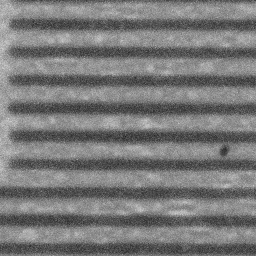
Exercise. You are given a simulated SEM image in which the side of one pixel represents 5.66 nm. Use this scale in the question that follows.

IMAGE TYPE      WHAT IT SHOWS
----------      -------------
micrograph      parallel lines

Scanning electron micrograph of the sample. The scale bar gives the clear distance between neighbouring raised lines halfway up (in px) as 14.7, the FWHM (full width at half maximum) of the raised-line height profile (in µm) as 0.0735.